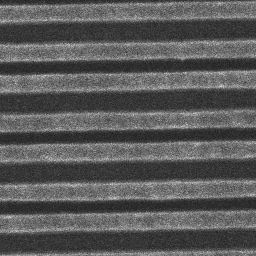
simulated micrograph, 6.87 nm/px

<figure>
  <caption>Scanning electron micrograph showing parallel lines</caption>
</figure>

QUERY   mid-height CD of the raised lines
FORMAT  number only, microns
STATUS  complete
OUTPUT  0.131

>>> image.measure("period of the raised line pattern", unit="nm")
239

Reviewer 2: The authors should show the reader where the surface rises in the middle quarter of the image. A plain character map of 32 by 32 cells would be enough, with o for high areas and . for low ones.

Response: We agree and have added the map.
................................
................................
oooooooooooooooooooooooooooooooo
oooooooooooooooooooooooooooooooo
oooooooooooooooooooooooooooooooo
oooooooooooooooooooooooooooooooo
ooooooooooooooooooooooo.........
................................
................................
................................
................................
................................
oooooooooooooooooooooooooooooooo
oooooooooooooooooooooooooooooooo
oooooooooooooooooooooooooooooooo
oooooooooooooooooooooooooooooooo
oooooooooooooooooooooooo........
................................
................................
...........................ooooo
oooooooooooooooooooooooooooooooo
oooooooooooooooooooooooooooooooo
oooooooooooooooooooooooooooooooo
oooooooooooooooooooooooooooooooo
ooo.............................
................................
................................
................................
................................
.................ooooooooooooooo
oooooooooooooooooooooooooooooooo
oooooooooooooooooooooooooooooooo